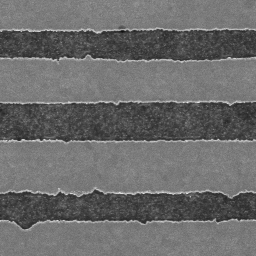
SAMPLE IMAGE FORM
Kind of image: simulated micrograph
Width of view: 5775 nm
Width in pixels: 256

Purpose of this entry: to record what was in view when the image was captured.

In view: one or a few lines or trenches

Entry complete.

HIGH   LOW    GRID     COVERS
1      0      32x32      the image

11111111111111111111111111111111
11111111111111111111111111111111
11111111111111111111111111111111
11111111111111111111111111111111
00000000000000000100001000000000
00000000011000000000001000000000
00000000011000000000000000000000
11111111111111000001100000011111
11111111111111111111111111111111
11111111111111111111111111111111
11111111111111111111111111111111
11111111111111111111111111111111
11111111111111111111111111111111
00000000000000000000000000000000
00000000000000000000000000000000
00000000000000000000110000000000
00000000000000010000111010000000
00000000000000010000111000000000
11111111111111111111111111111111
11111111111111111111111111111111
11111111111111111111111111111111
11111111111111111111111111111111
11111111111111111111111111111111
11111111111111111111111111111111
00000000000000000000000000001000
00000000000000000000000000000000
01100001000000000000100000000000
00000000000000000000100000000101
11101111111111111111111111111111
11111111111111111111111111111111
11111111111111111111111111111111
11111111111111111111111111111111